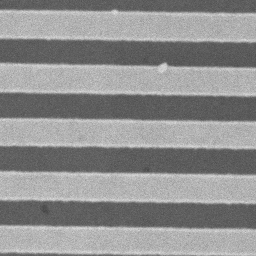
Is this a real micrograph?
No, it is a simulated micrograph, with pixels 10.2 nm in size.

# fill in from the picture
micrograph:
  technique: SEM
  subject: lines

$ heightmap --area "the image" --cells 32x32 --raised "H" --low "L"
LLLLLLLLLLLLLLLLLLLLLLLLLLLLLLLL
HHHHHHHHHHHHHHHHHHLHLLLLLLLLLLLL
HHHHHHHHHHHHHHHHHHHHHHHHHHHHHHHH
HHHHHHHHHHHHHHHHHHHHHHHHHHHHHHHH
HHHHHHHHHHHHHHHHHHHHHHHHHHHHHHHH
LLLLLLLLLLLLLLLLLLLLLLLLLLLLLLLL
LLLLLLLLLLLLLLLLLLLLLLLLLLLLLLLL
LLLLLLLLLLLLLLLLLLLLLLLLLLLLLLLL
HHHHHHHHHHHHHHHHHHHHHHHHHHHHHLLL
HHHHHHHHHHHHHHHHHHHHHHHHHHHHHHHH
HHHHHHHHHHHHHHHHHHHHHHHHHHHHHHHH
HHHHHHHHHHHHHHHHHHHHHHHHHHHHHHHH
LLLLLLLLLLLLLLLLLLLLLLLLLLLLLLLL
LLLLLLLLLLLLLLLLLLLLLLLLLLLLLLLL
LLLLLLLLLLLLLLLLLLLLLLLLLLLLLLLL
HHHHHHHHHHHHHHHHHHHHHHHHHHHHHHHH
HHHHHHHHHHHHHHHHHHHHHHHHHHHHHHHH
HHHHHHHHHHHHHHHHHHHHHHHHHHHHHHHH
LLLLLLLLLLLLLLLLLLLLLLLLHLHHHHHH
LLLLLLLLLLLLLLLLLLLLLLLLLLLLLLLL
LLLLLLLLLLLLLLLLLLLLLLLLLLLLLLLL
HHLLLLLLLLLLLLLLLLLLLLLLLLLLLLLL
HHHHHHHHHHHHHHHHHHHHHHHHHHHHHHHH
HHHHHHHHHHHHHHHHHHHHHHHHHHHHHHHH
HHHHHHHHHHHHHHHHHHHHHHHHHHHHHHHH
LLLLLLLLLLLLLLLLLLLLLLLLLLLLHLHL
LLLLLLLLLLLLLLLLLLLLLLLLLLLLLLLL
LLLLLLLLLLLLLLLLLLLLLLLLLLLLLLLL
HHHHHHHHHHHHHHHHLLLLLLLLLLLLLLLL
HHHHHHHHHHHHHHHHHHHHHHHHHHHHHHHH
HHHHHHHHHHHHHHHHHHHHHHHHHHHHHHHH
HLHHHHHHHHHHHHHHHHHHHHHHHHHHHHHH